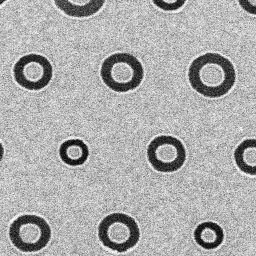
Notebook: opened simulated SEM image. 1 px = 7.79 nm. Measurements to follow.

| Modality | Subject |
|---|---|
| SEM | ring-shaped grooves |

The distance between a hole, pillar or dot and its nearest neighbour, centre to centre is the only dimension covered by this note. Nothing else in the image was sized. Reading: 89.2 px